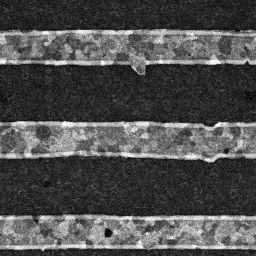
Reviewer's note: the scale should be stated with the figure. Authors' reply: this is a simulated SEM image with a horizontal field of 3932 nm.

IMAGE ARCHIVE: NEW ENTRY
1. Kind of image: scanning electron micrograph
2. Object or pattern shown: one or a few lines or trenches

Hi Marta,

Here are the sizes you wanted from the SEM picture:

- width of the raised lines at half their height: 0.461 microns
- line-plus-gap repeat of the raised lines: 1420 nm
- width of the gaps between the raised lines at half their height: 61.8 pixels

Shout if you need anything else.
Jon